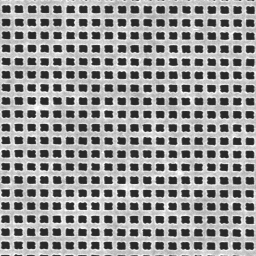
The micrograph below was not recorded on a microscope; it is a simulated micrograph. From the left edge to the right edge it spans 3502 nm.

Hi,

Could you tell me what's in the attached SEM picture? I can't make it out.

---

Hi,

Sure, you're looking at a regular array of holes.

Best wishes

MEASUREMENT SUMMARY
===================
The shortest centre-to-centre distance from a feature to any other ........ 0.17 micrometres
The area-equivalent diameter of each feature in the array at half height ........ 122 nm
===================